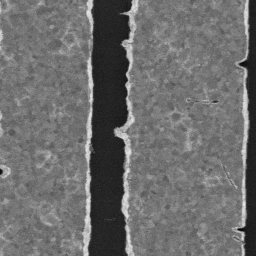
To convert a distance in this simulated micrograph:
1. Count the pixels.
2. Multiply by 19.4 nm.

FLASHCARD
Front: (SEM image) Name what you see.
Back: one or a few lines or trenches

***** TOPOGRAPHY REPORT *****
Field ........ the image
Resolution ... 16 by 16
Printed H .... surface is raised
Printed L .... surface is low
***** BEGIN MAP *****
HHHHHHLLHHHHHHHL
HHHHHHLLHHHHHHHL
HHHHHHLLHHHHHHHL
HHHHHHLLHHHHHHHL
HHHHHHLLHHHHHHHL
HHHHHHLLHHHHHHHL
HHHHHHLLHHHHHHHL
HHHHHHLLHHHHHHHL
HHHHHHLLHHHHHHHL
HHHHHHLLHHHHHHHL
HHHHHHLLHHHHHHHL
HHHHHLLLHHHHHHHL
HHHHHHLLHHHHHHHL
HHHHHHLLHHHHHHHL
HHHHHLLLHHHHHHHL
HHHHHLLLHHHHHHHL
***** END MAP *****